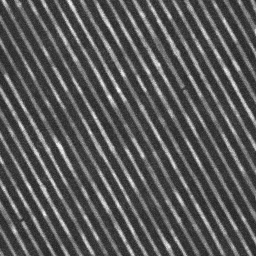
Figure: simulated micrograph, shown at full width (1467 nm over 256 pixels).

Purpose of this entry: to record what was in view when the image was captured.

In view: parallel lines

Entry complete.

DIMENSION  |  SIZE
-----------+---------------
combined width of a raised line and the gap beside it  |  65.4 nanometres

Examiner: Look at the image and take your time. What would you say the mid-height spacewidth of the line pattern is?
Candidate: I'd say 8.83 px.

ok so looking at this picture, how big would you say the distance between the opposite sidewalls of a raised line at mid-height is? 0.0169 micrometres